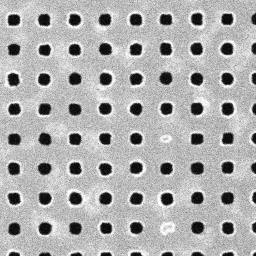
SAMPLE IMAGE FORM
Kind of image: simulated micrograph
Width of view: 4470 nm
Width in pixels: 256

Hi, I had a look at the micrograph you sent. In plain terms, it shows a regular array of holes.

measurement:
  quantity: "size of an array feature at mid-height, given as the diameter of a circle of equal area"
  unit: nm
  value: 236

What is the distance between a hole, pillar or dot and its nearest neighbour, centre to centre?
0.516 microns